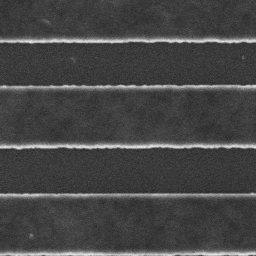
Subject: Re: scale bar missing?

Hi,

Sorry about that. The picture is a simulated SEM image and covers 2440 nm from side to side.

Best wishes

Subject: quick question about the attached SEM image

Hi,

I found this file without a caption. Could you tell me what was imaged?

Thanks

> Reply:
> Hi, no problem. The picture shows lines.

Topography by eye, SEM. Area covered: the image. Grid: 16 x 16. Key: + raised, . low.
++++++++++++++++
++++++++++++++++
++++++++++++++++
................
................
++++++++++++++++
++++++++++++++++
++++++++++++++++
++++++++++++++++
................
................
................
++++++++++++++++
++++++++++++++++
++++++++++++++++
++++++++++++++++